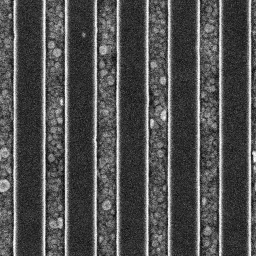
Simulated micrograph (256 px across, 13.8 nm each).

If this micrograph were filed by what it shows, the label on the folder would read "parallel lines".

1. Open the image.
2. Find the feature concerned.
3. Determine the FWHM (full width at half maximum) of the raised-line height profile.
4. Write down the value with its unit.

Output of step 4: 428 nanometers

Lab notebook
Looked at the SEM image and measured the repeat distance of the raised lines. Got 705 nanometers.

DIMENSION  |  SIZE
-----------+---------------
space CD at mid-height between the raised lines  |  289 nanometres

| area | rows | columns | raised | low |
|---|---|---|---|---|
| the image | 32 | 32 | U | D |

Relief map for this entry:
DDUUUUDDUUUUDDDUUUDDDUUUUDDUUUUD
DDUUUUDDUUUUDDDUUUDDDUUUUDDUUUUD
DDUUUUDDUUUUDDDUUUDDDUUUUDDUUUUD
DDUUUUDDUUUUDDDUUUDDDUUUUDDUUUUD
DDUUUUDDUUUUDDDUUUDDDUUUUDDUUUUD
DDUUUUDDUUUUDDDUUUDDDUUUUDDUUUUD
DDUUUUDDUUUUDDDUUUDDDUUUUDDUUUUD
DDUUUUDDUUUUDDDUUUDDDUUUUDDUUUUD
DDUUUUDDUUUUDDDUUUDDDUUUUDDUUUUD
DDUUUUDDUUUUDDDUUUDDDUUUUDDUUUUD
DDUUUUDDUUUUDDDUUUDDDUUUUDDUUUUD
DDUUUUDDUUUUDDDUUUDDDUUUUDDUUUUD
DDUUUUDDUUUUDDDUUUUDDUUUUDDUUUUD
DDUUUUDDUUUUDDDUUUDDDUUUUDDUUUUD
DDUUUUDDUUUUDDDUUUDDDUUUUDDUUUUD
DDUUUUDDUUUUDDDUUUDDDUUUUDDUUUUD
DDUUUUDDUUUUDDDUUUDDDUUUUDDUUUUD
DDUUUUDDUUUUDDDUUUDDDUUUUDDDUUUD
DDUUUUDDUUUUDDDUUUDDDUUUUDDUUUUD
DDUUUUDDUUUUDDDUUUDDDUUUUDDDUUUD
DDUUUUDDUUUUDDDUUUDDDUUUUDDUUUUD
DDUUUUDDUUUUDDDUUUDDDUUUUDDUUUUD
DDUUUUDDUUUUDDDUUUDDDUUUUDDUUUUD
DDUUUUDDUUUUDDDUUUDDDUUUUDDDUUUD
DDUUUUDDUUUUDDDUUUDDDUUUUDDUUUUD
DDUUUUDDUUUUDDDUUUDDDUUUUDDUUUUD
DDUUUUDDUUUUDDDUUUDDDUUUUDDUUUUD
DDUUUUDDUUUUDDDUUUDDDUUUUDDUUUUD
DDUUUUDDUUUUDDDUUUDDDUUUUDDUUUUD
DDUUUUDDUUUUDDDUUUDDDUUUUDDUUUUD
DDUUUUDDUUUUDDDUUUDDDUUUUDDUUUUD
DDUUUUDDUUUUDDDUUUDDDUUUUDDUUUUD